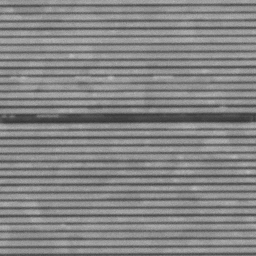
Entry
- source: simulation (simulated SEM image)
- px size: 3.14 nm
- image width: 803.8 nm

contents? parallel lines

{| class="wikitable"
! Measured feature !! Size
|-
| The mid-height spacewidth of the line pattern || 2.99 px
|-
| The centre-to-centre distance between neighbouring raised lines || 24.5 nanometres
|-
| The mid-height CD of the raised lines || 15.7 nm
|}